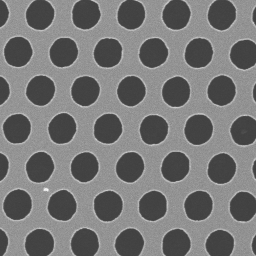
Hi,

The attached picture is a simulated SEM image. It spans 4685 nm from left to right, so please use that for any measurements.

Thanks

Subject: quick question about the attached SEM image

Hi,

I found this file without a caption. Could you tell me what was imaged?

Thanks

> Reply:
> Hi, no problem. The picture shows a regular array of holes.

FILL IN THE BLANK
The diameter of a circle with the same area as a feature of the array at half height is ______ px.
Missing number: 29.4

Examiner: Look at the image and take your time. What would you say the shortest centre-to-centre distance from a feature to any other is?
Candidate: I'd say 806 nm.